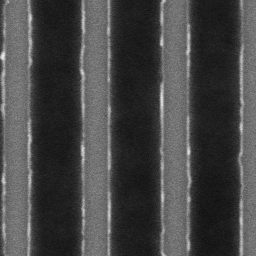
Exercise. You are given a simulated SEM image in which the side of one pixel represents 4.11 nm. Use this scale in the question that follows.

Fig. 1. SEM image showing one or a few lines or trenches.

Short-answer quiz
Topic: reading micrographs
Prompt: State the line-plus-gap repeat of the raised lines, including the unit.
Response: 326 nanometres